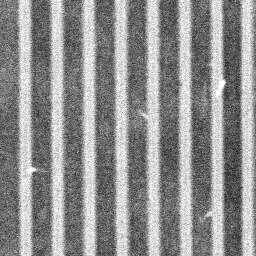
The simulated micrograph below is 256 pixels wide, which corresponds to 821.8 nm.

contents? parallel lines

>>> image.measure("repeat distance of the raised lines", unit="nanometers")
102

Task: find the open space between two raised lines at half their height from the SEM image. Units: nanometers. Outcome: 66.2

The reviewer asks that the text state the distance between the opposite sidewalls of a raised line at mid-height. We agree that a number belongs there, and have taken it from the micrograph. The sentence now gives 0.0361 microns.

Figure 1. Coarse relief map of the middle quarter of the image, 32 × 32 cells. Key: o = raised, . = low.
.....ooo.....ooo.....oo......ooo
.....ooo.....ooo.....oo......ooo
.....ooo.....ooo.....oo......oo.
.....ooo.....ooo.....oo......oo.
.....ooo.....ooo.....oo......oo.
.....ooo.....ooo.....oo......oo.
.....ooo.....ooo.....oo......ooo
.....ooo.....ooo.....oo......ooo
.....ooo.....ooo.....oo......ooo
.....ooo.....ooo.....oo......ooo
.....ooo.....ooo.....ooo.....ooo
.....ooo.....ooo.....ooo.....ooo
.....ooo.....ooo.....ooo.....ooo
.....ooo.....ooo.....ooo.....ooo
.....ooo.....ooo.....ooo.....ooo
.....ooo.....ooo.....ooo.....oo.
.....ooo.....ooo.....ooo.....oo.
.....ooo.....ooo.....ooo.....oo.
.....ooo.....ooo.....ooo.....ooo
.....ooo.....ooo.....ooo.....ooo
.....ooo.....ooo.....ooo.....ooo
.....ooo.....ooo.....ooo.....ooo
.....ooo.....ooo.....ooo.....ooo
.....ooo.....ooo.....ooo.....oo.
.....ooo.....ooo.....ooo.....ooo
.....ooo.....ooo.....ooo.....ooo
.....ooo.....ooo.....ooo.....ooo
.....ooo.....ooo.....ooo.....ooo
.....ooo.....ooo.....ooo.....ooo
.....ooo.....ooo.....ooo.....ooo
.....ooo.....ooo.....ooo.....ooo
.....ooo.....ooo.....ooo.....ooo